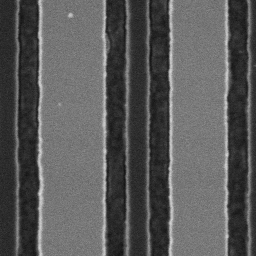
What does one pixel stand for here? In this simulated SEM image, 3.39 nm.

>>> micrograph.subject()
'lines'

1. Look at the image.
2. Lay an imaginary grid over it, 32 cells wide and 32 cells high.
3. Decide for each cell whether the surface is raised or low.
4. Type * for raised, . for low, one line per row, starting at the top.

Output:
**...********...***..*******...*
**...********...***..*******...*
**...********...***..*******...*
**...********...***..*******...*
**...********...***..*******...*
**...********...***..*******...*
**...********...***..*******...*
**...********...***..*******...*
**...********...***..*******...*
**...********...***..*******...*
**...********...***..*******...*
**...********...***..*******...*
**...********...***..*******...*
**...********...***..*******...*
**...********...***..*******...*
**...********...***..*******...*
**...********...***..*******...*
**...********...***..*******...*
**...********...***..*******...*
**...********...***..*******...*
**...********...***..*******...*
**...********...***..*******...*
**...********...***..*******...*
**...********...***..*******...*
**...********...***..*******...*
**...********...***..*******...*
**...********...***..*******...*
**...********...***..*******...*
**...********...***..*******...*
**...********...***..*******...*
**...********...***..*******...*
**...********...***..*******...*